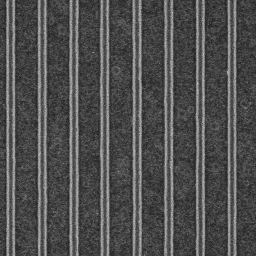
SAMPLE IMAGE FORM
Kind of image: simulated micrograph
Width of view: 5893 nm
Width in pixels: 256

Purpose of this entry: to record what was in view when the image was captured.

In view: parallel lines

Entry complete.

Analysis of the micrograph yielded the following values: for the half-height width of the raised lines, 158 nm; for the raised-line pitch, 729 nm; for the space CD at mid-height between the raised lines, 567 nm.